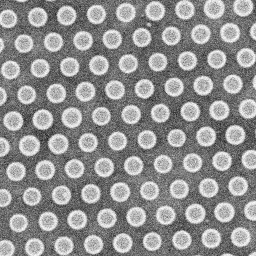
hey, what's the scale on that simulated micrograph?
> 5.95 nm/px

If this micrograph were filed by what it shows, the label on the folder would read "an array of small figures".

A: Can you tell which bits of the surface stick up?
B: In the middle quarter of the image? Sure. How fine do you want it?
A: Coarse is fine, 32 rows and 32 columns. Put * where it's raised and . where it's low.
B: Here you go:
****..*****...****...****....***
****...****...****....**......*.
***.....**......................
................................
............**....****....****..
...****....****...****...*****..
...*****..*****...****...*****..
...*****...****...****....***...
....***.....**..................
................................
................**.....**.....**
****....***....****...****...***
****...****....****...****...***
****...*****...****...****....**
****....***....***..............
.**.............................
...........................**...
.....**.....***....****...****..
....****...*****...****...****..
*...****...*****...****...****..
*...****....***....***.....**...
*....**.........................
................................
................***....***....**
.***....****...****....****...**
.****...****...*****...****...**
*****...****...****....***.....*
.****...****....**..............
................................
...........................***..
.....***....****...****....****.
*....****...****...*****...****.